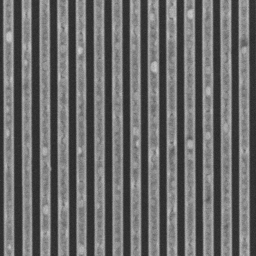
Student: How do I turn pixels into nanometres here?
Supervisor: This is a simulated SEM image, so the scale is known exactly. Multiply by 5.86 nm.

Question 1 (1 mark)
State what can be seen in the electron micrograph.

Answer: parallel lines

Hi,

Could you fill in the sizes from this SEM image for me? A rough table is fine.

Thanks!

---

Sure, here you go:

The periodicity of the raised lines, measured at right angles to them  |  0.106 µm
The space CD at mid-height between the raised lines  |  0.0483 um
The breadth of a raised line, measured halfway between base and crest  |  0.0593 microns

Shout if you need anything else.